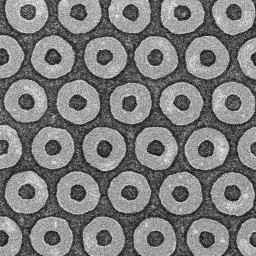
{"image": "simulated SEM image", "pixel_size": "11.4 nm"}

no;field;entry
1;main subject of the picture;a regular array of ring-shaped raised bodies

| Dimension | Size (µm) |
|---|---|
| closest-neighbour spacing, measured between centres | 0.581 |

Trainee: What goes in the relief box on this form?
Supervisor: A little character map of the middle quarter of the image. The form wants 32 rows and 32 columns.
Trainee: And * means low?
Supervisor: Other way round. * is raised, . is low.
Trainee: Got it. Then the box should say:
**....*********...****.*****...*
**.....********....********....*
.......******.......******......
......................*.........
..***...........................
*******.......*****........*****
********.....********....*******
********....*********....****.**
**...****...***...****..****...*
*.....***...***...****..***.....
*....****...***...****..****...*
**..*****...***..*****...****..*
********....*********....*******
*******......*******......******
..****.........****........*****
................................
.......******.......******......
*.....********.....********.....
**...**********...*********....*
**...****..****...****..****...*
**...***....***...***....***..**
**...***....***...***....***..**
**...****..****...****...***..**
**...*****.****...**********...*
*.....********.....********....*
.......******........*****......
................................
.*****........*****.........***.
*******......*******......******
********....*********....*******
**...***....***...***...****..**
**...****..***....***...***....*